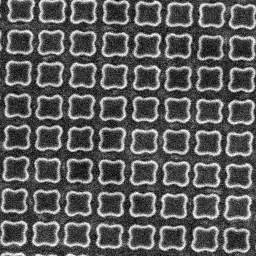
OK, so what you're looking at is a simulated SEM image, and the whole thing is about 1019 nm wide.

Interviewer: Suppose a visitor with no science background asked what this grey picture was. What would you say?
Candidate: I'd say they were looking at a regular array of raised bodies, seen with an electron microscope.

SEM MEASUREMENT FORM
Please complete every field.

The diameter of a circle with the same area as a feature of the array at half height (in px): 26.2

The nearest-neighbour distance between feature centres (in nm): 125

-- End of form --